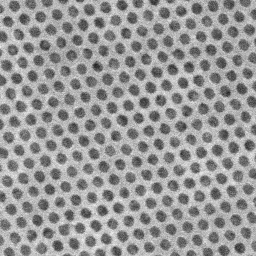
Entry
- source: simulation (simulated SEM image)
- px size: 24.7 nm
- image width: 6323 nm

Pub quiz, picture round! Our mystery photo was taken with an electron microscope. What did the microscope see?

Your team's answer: a regular array of raised bodies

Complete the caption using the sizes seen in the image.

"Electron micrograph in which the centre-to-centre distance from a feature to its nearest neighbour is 400 nm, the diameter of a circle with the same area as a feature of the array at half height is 0.307 microns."